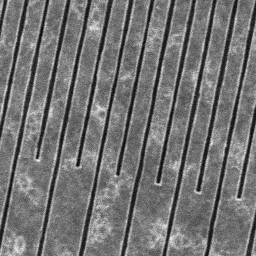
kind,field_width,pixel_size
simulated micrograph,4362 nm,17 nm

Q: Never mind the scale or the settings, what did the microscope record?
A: parallel lines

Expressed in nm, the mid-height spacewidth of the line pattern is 79.4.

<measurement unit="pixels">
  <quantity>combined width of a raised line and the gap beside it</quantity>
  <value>20.6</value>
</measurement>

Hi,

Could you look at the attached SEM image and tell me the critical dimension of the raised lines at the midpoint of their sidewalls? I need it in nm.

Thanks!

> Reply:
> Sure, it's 267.